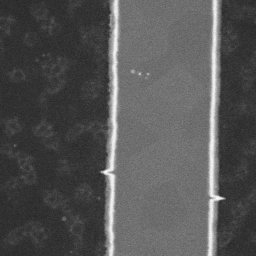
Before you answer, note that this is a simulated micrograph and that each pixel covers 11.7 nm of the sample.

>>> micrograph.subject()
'one or a few lines or trenches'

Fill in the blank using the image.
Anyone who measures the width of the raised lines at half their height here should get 1150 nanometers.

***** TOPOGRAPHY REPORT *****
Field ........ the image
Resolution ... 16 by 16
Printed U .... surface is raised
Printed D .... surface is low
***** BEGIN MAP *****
DDDDDDDUUUUUUDDD
DDDDDDDUUUUUUDDD
DDDDDDDUUUUUUDDD
DDDDDDDUUUUUUDDD
DDDDDDDUUUUUUDDD
DDDDDDDUUUUUUDDD
DDDDDDDUUUUUUDDD
DDDDDDDUUUUUUDDD
DDDDDDDUUUUUUDDD
DDDDDDDUUUUUUDDD
DDDDDDDUUUUUUDDD
DDDDDDDUUUUUUDDD
DDDDDDDUUUUUUDDD
DDDDDDDUUUUUUDDD
DDDDDDDUUUUUUDDD
DDDDDDDUUUUUUDDD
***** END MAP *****